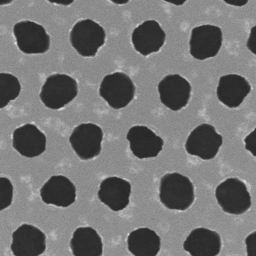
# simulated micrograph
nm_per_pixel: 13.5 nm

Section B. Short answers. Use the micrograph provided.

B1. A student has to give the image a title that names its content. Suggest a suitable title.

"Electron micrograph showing a regular array of holes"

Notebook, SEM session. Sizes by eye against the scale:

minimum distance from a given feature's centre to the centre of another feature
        766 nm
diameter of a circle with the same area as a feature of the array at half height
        0.454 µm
